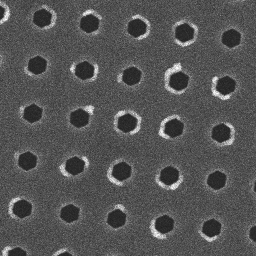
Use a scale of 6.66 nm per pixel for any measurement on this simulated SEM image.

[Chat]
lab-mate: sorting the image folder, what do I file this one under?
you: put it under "a regular array of holes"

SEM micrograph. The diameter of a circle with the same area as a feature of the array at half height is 124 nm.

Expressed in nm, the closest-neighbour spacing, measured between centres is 315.